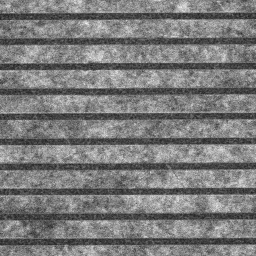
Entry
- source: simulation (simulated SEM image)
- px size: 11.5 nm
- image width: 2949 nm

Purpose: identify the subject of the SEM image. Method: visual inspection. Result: parallel lines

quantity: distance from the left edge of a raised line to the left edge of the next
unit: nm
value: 288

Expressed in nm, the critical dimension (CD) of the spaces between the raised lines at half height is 202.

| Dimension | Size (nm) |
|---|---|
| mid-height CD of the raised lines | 84.9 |